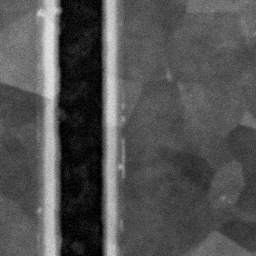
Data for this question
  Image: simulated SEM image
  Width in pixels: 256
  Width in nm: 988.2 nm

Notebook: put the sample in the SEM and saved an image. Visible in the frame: one or a few lines or trenches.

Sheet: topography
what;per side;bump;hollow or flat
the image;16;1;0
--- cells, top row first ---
1110000111111111
1110000111111111
1110000111111111
1110000111111111
1110000111111111
1110000111111111
1110000111111111
1110000111111111
1110000111111111
1110000111111111
1110000111111111
1110000111111111
1110000111111111
1110000111111111
1110000111111111
1110000111111111